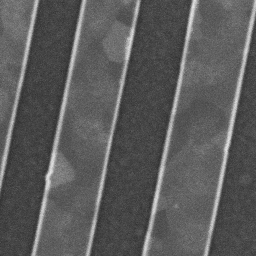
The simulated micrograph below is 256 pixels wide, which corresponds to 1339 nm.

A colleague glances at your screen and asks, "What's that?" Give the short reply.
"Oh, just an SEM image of one or a few lines or trenches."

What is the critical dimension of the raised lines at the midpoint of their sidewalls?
295 nm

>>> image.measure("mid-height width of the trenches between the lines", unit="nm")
287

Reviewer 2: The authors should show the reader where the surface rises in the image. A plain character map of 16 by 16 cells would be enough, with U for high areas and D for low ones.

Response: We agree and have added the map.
UUDDDUUUUDDDUUUU
UUDDDUUUDDDDUUUU
UUDDDUUUDDDDUUUU
UUDDDUUUDDDDUUUD
UDDDUUUUDDDUUUUD
UDDDUUUUDDDUUUUD
UDDDUUUDDDDUUUUD
UDDDUUUDDDDUUUUD
UDDDUUUDDDDUUUDD
DDDUUUUDDDUUUUDD
DDDUUUUDDDUUUUDD
DDDUUUDDDDUUUUDD
DDDUUUDDDDUUUUDD
DDDUUUDDDDUUUDDD
DDUUUUDDDUUUUDDD
DDUUUUDDDUUUUDDD